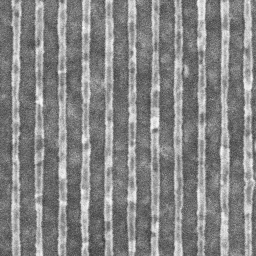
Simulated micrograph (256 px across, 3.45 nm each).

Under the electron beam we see parallel lines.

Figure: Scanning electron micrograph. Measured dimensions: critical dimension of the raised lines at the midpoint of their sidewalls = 20.3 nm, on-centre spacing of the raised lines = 0.08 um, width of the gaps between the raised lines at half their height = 0.06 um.